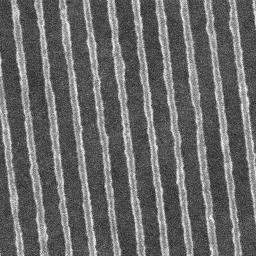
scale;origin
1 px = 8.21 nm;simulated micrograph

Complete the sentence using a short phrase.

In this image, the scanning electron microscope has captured parallel lines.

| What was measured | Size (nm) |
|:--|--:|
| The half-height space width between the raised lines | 153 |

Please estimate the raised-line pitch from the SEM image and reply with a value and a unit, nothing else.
0.198 micrometres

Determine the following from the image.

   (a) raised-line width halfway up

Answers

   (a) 47.9 nm